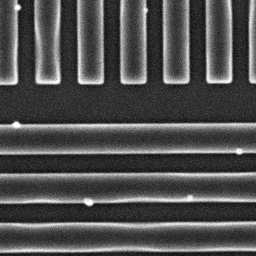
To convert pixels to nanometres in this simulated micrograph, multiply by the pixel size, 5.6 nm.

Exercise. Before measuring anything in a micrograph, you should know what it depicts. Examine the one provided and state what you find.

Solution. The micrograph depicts groups of lines, slits or small figures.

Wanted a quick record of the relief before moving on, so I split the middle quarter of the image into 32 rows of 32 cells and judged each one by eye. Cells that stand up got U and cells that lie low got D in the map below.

DDDDUUUUUUDDDDUUUUUUDDDDDUUUUUUD
DDDDUUUUUUDDDDUUUUUUDDDDDUUUUUUD
DDDDUUUUUUDDDDUUUUUUDDDDDUUUUUUD
DDDDUUUUUUDDDDUUUUUUDDDDDUUUUUUD
DDDDUUUUUUDDDDDUUUUUDDDDDUUUUUUD
DDDDDDDDDDDDDDDDDDDDDDDDDDDDDDDD
DDDDDDDDDDDDDDDDDDDDDDDDDDDDDDDD
DDDDDDDDDDDDDDDDDDDDDDDDDDDDDDDD
DDDDDDDDDDDDDDDDDDDDDDDDDDDDDDDD
DDDDDDDDDDDDDDDDDDDDDDDDDDDDDDDD
DDDDDDDDDDDDDDDDDDDDDDDDDDDDDDDD
DDDDDDDDDDDDDDDDDDDDDDDDDDDDDDDD
DDDDDDDDDDDDDDDDDDDDDDDDDDDDDDDD
DDDDDDDDDDDDDDDDDDDDDDDDDDDDDDDD
DDDDDDDDDDDDDDDDDDDDDDDDDDDDDDDD
UUUUUUUUUUUUUUUUUUUUUUUUUUUUUUUU
UUUUUUUUUUUUUUUUUUUUUUUUUUUUUUUU
UUUUUUUUUUUUUUUUUUUUUUUUUUUUUUUU
UUUUUUUUUUUUUUUUUUUUUUUUUUUUUUUU
UUUUUUUUUUUUUUUUUUUUUUUUUUUUUUUU
UUUUUUUUUUUUUUUUUUUUUUUUUUUUUUUU
UUUUUUUUUUUUUUUUUUUUUUUUUUUUUUUU
DDDDDDDDDDDDDDDDDDDDDDDDDDDDDDDD
DDDDDDDDDDDDDDDDDDDDDDDDDDDDDDDD
DDDDDDDDDDDDDDDDDDDDDDDDDDDDDDDD
DDDDDDDDDDDDDDDDDDDDDDDDDDDDDDDD
DDDDDDDDDDDDDDDDDDDDDDDDDDDDDDDD
UUUUUUUUUUUUUUUUUUUUUUUUUUUUUUDD
UUUUUUUUUUUUUUUUUUUUUUUUUUUUUUUU
UUUUUUUUUUUUUUUUUUUUUUUUUUUUUUUU
UUUUUUUUUUUUUUUUUUUUUUUUUUUUUUUU
UUUUUUUUUUUUUUUUUUUUUUUUUUUUUUUU